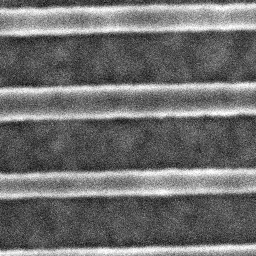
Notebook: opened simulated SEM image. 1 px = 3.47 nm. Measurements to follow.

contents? lines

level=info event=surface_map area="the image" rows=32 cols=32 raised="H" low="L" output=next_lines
LLLLLLLLLLLLLLLLLLLLLLLLLLLLLLLL
HHHHHHHHHHHHHHHHHHHHHHHHHHHHHHHH
HHHHHHHHHHHHHHHHHHHHHHHHHHHHHHHH
HHHHHHHHHHHHHHHHHHHHHHHHHHHHHLLL
LLLLLLLLLLLLLLLLLLLLLLLLLLLLLLLL
LLLLLLLLLLLLLLLLLLLLLLLLLLLLLLLL
LLLLLLLLLLLLLLLLLLLLLLLLLLLLLLLL
LLLLLLLLLLLLLLLLLLLLLLLLLLLLLLLL
LLLLLLLLLLLLLLLLLLLLLLLLLLLLLLLL
LLLLLLLLLLLLLLLLLLLLLLLLLLLLLLLL
LLLLLLLLLLLLLLLLLLLLLLLLLLLLLLLL
HHHHHHHHHHHHHHHHHHHHHHHHHHHHHHHH
HHHHHHHHHHHHHHHHHHHHHHHHHHHHHHHH
HHHHHHHHHHHHHHHHHHHHHHHHHHHHHHHH
HHHHHHHHHHHHHHHHHHLHHLLLLLLLLLLL
LLLLLLLLLLLLLLLLLLLLLLLLLLLLLLLL
LLLLLLLLLLLLLLLLLLLLLLLLLLLLLLLL
LLLLLLLLLLLLLLLLLLLLLLLLLLLLLLLL
LLLLLLLLLLLLLLLLLLLLLLLLLLLLLLLL
LLLLLLLLLLLLLLLLLLLLLLLLLLLLLLLL
LLLLLLLLLLLLLLLLLLLLLLLLLLLLLLLL
LLLLLLLLLLLLLLLHHHHHHHHHHHHHHHHH
HHHHHHHHHHHHHHHHHHHHHHHHHHHHHHHH
HHHHHHHHHHHHHHHHHHHHHHHHHHHHHHHH
HHHHLLHHHLLLLLLLLLLLLLLLLLLLLLLL
LLLLLLLLLLLLLLLLLLLLLLLLLLLLLLLL
LLLLLLLLLLLLLLLLLLLLLLLLLLLLLLLL
LLLLLLLLLLLLLLLLLLLLLLLLLLLLLLLL
LLLLLLLLLLLLLLLLLLLLLLLLLLLLLLLL
LLLLLLLLLLLLLLLLLLLLLLLLLLLLLLLL
LLLLLLLLLLLLLLLLLLLLLLLLLLLLLLLL
LHHHHHHHHHHHHHHHHHHHHHHHHHHHHHHH